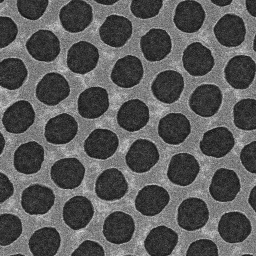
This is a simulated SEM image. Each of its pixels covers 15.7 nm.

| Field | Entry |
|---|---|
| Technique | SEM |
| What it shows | a regular array of holes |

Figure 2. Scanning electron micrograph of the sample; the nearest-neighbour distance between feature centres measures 654 nm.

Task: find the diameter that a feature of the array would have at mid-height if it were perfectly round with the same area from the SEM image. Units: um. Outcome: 0.514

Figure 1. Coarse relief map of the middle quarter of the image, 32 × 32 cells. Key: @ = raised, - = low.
@-------@@@@--------@@@@@@@@@@--
@@-----@@@@@--------@@@@@@@@@@--
@@@@-@@@@@@@--------@@@@-----@@-
@@@@@@@@@@@@--------@@@-------@@
-@@@@@@@@@@@-------@@@--------@@
-@@@@@@@@@@@@-----@@@@--------@@
--@@@-----@@@@@@@@@@@@--------@@
-@@@-------@@@@@@@@@@@-------@@@
-@@@-------@@@@@@@@@@@@------@@-
@@@--------@@@@-----@@@@----@@@-
@@@--------@@@-------@@@@@@@@@@-
@@@--------@@@-------@@@@@@@@@@@
-@@@------@@@--------@@@@@----@@
--@@@---@@@@@--------@@@-------@
---@@@@@@@@@@--------@@@-------@
----@@@@@@@@@@------@@@@--------
----@@@@---@@@@----@@@@---------
---@@@-------@@@@@@@@@@@-------@
--@@@@--------@@@@@@@@@@-------@
-@@@@---------@@@@----@@@-----@@
@@@@@---------@@@------@@@@@@@@@
@@@@@--------@@@-------@@@@@@@@@
@@@@@@------@@@@--------@@@@----
---@@@@----@@@@---------@@@-----
----@@@@@@@@@@@--------@@@@-----
-----@@@@@@@@@@@------@@@@------
-----@@@@@----@@@----@@@@@------
-----@@@@------@@@@@@@@@@@------
-----@@@-------@@@@@@@@@@@------
----@@@@--------@@@@@@@@@@@-----
----@@@@--------@@@@---@@@@@@--@
@@@@@@@@--------@@@-------@@@@@@